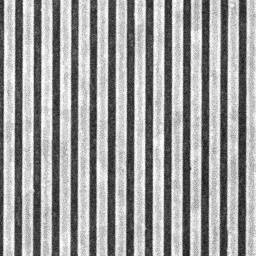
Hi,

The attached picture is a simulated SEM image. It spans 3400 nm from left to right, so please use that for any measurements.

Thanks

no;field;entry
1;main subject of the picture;parallel lines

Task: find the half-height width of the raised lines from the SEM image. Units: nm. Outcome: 114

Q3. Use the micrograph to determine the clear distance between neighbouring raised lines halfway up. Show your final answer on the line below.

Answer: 9.5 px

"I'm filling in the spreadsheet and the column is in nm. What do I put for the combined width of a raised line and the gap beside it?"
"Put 248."